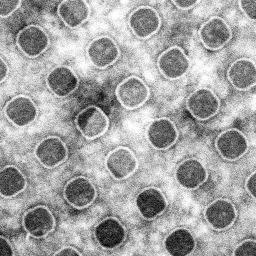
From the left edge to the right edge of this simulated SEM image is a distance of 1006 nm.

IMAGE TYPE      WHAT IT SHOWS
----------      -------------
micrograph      a regular array of raised bodies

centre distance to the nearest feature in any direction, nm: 196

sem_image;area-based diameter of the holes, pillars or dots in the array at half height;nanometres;124